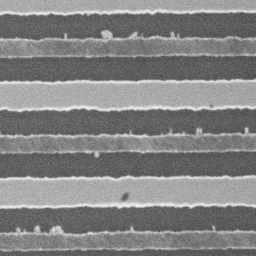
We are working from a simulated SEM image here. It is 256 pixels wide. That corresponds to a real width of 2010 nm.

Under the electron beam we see lines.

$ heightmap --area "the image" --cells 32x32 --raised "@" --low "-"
@@@@@@@@@@@@@@@@@@@@@@@@@@@@@@@@
@@@@@@@@@@@@@@@@@@@@@@@@@@@@@@@@
--------------------------------
--------------------------------
-------------@------------------
@@@@@@@@@@@@@@@@@@@@@@@@@@@@@@@@
@@@@@@@@@@@@@@@@@@@@@@@@@@@@@@@@
--------------------------------
--------------------------------
--------------------------------
@@@@@@@@@@@@@@@@@@@@@@@@@@@@@@@@
@@@@@@@@@@@@@@@@@@@@@@@@@@@@@@@@
@@@@@@@@@@@@@@@@@@@@@@@@@@@@@@@@
@@@@@@@@@--@@@@@@@@-@@@@@@@@----
--------------------------------
--------------------------------
--------------------------------
@@@@@@@@@@@@@@@@@@@@@@@@@@@@@@@@
@@@@@@@@@@@@@@@@@@@@@@@@@@@@@@@@
--------------------------------
--------------------------------
--------------------------------
@@@@@@@@@@@@@@@@@@@@@@@@@@@@@@@@
@@@@@@@@@@@@@@@@@@@@@@@@@@@@@@@@
@@@@@@@@@@@@@@@@@@@@@@@@@@@@@@@@
@@@@@@@@@@@@@@@@@@@@@@@@@@@@@@@@
--------------------------------
--------------------------------
--------------------------------
@@@@@@@@@@@@@@@@@@@@@@@@@@@@@@@@
@@@@@@@@@@@@@@@@@@@@@@@@@@@@@@@@
--------------------------------